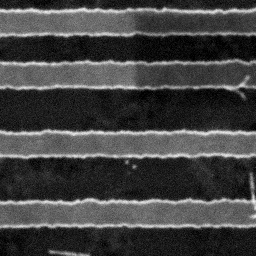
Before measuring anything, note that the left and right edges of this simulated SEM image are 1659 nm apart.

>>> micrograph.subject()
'lines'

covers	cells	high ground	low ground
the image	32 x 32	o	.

................................
oooooooooooooooooooooooooooooooo
oooooooooooooooooooooooooooooooo
oooooooooooooooooooooooooooooooo
................................
................................
................................
................................
oooooooooooooooooooooooooooooooo
oooooooooooooooooooooooooooooooo
oooooooooooooooooooooooooooooooo
................................
................................
................................
................................
................................
o....oooo..o...o..ooo.oo..ooo...
oooooooooooooooooooooooooooooooo
oooooooooooooooooooooooooooooooo
oooooooooooo.ooooooooo.oo...ooo.
................................
................................
................................
................................
................................
oooooooooooooooooooooooooooooooo
oooooooooooooooooooooooooooooooo
oooooooooooooooooooooooooooooooo
................................
................................
................................
................................